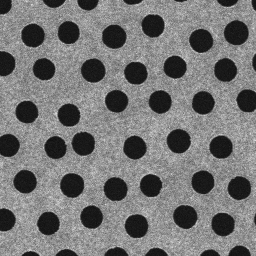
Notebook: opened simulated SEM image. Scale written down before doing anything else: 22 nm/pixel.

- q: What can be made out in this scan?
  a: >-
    a regular array of holes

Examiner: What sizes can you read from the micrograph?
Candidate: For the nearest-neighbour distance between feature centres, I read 0.817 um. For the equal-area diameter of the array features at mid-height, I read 519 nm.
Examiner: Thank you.